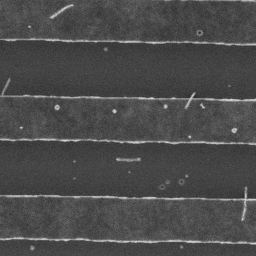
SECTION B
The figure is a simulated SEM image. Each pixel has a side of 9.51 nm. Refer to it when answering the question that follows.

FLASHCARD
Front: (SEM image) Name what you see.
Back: lines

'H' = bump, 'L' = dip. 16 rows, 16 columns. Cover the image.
HHHHHHHHHHHHHHHH
HHHHHHHHHHHHHHHH
HLLHHHHHHHHHHHHH
LLLLLLLLLLLLLLLL
LLLLLLLLLLLLLLLL
LLLLLLLLLLLLLLLL
HHHHHHHHHHHHHHHH
HHHHHHHHHHHHHHHH
HHHHHHHHHHHHHHHH
LLLLLLLLLLLLLLLL
LLLLLLLLLLLLLLLL
LLLLLLLLLLLLLLLL
HHHHHHHHHHHHHHHH
HHHHHHHHHHHHHHHH
HHHHHHHHHHHHHHHH
LLLLLLLLLLLLLLLL